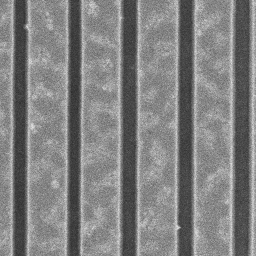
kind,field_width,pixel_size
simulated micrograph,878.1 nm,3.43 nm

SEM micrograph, parallel lines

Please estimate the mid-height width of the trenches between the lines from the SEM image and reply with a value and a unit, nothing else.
51.5 nanometers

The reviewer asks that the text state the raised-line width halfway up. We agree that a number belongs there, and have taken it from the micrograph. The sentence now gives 141 nm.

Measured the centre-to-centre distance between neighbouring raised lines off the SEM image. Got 55.3 pixels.